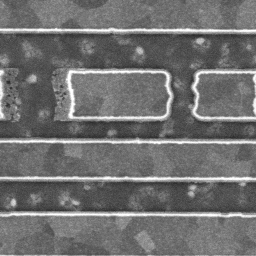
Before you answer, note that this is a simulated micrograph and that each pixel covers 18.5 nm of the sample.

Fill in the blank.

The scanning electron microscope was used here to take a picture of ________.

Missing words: one or a few lines or trenches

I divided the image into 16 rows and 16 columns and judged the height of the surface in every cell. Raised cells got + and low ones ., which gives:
++++++++++++++++
++++++++++++++++
................
................
.....+++++......
....+++++++.++++
.....++++++.++++
................
................
++++++++++++++++
++++++++++++++++
................
................
++++++++++++++++
++++++++++++++++
++++++++++++++++